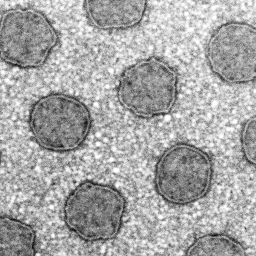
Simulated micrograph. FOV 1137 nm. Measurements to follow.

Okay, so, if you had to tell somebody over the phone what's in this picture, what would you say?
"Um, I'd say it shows raised bodies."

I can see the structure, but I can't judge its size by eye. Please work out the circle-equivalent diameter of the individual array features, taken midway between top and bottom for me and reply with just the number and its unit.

245 nm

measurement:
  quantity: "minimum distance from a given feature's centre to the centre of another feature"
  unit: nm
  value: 416